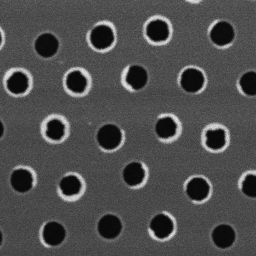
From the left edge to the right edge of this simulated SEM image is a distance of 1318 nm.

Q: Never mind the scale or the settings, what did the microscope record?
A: a regular array of holes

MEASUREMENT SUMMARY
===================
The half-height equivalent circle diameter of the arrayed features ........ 120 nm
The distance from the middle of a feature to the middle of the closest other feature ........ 51.1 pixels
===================